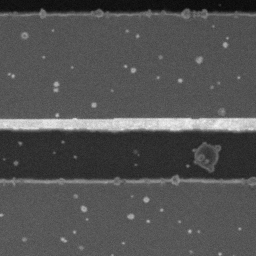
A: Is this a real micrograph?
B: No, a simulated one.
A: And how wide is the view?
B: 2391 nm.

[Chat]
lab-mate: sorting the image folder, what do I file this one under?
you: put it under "lines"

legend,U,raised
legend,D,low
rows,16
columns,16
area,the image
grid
DDDDDDDDDDDDDDDD
UUUUUUUUUUUUUUUU
UUUUUUUUUUUUUUUU
UUUUUUUUUUUUUUUU
UUUUUUUUUUUUUUUU
UUUUUUUUUUUUUUUU
UUUUUUUUUUUUUUUU
UUUUUUUUUUUUUUUU
DDDDDDDDDDDDDDDD
DDDDDDDDDDDDDDDD
DDDDDDDDDDDDDDDD
UUUUUUUUUUUUUUUU
UUUUUUUUUUUUUUUU
UUUUUUUUUUUUUUUU
UUUUUUUUUUUUUUUU
UUUUUUUUUUUUUUUU